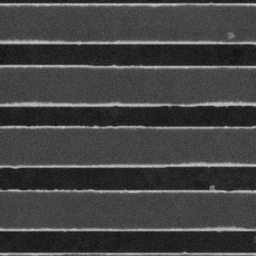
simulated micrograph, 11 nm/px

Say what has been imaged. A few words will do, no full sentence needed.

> lines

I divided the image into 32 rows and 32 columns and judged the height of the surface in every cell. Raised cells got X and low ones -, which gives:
--------------------------------
XXXXXXXXXXXXXXXXXXXXXXXXXXXXXXXX
XXXXXXXXXXXXXXXXXXXXXXXXXXXXXXXX
XXXXXXXXXXXXXXXXXXXXXXXXXXXXXXXX
XXXXXXXXXXXXXXXXXXXXXXXXXXXXXXXX
--------------------------------
--------------------------------
--------------------------------
XXXXXXXXXXXXXXXXXXXXXXXXXXXXXXXX
XXXXXXXXXXXXXXXXXXXXXXXXXXXXXXXX
XXXXXXXXXXXXXXXXXXXXXXXXXXXXXXXX
XXXXXXXXXXXXXXXXXXXXXXXXXXXXXXXX
XXXXXXXXXXXXXXXXXXXXXXXXXXXXXXXX
--------------------------------
--------------------------------
--------------------------------
XXXXXXXXXXXXXXXXXXXXXXXXXXXXXXXX
XXXXXXXXXXXXXXXXXXXXXXXXXXXXXXXX
XXXXXXXXXXXXXXXXXXXXXXXXXXXXXXXX
XXXXXXXXXXXXXXXXXXXXXXXXXXXXXXXX
XXXXXXXXXXXXXXXXXXXXXXXXXXXXXXXX
--------------------------------
--------------------------------
--------------------------------
XXXXXXXXXXXXXXXXXXXXXXXXXXXXXXXX
XXXXXXXXXXXXXXXXXXXXXXXXXXXXXXXX
XXXXXXXXXXXXXXXXXXXXXXXXXXXXXXXX
XXXXXXXXXXXXXXXXXXXXXXXXXXXXXXXX
XXXXXXXXXXXXXXXXXXXXXXXXXXXXXXXX
--------------------------------
--------------------------------
--------------------------------